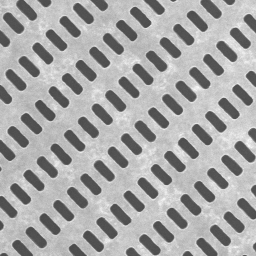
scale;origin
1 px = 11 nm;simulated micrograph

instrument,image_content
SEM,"a regular array of holes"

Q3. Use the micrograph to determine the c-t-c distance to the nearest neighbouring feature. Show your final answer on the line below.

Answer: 208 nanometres